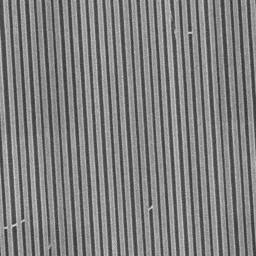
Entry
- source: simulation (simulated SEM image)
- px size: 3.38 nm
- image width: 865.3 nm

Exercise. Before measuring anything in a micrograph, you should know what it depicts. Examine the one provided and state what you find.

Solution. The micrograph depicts parallel lines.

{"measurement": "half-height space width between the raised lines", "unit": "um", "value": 0.0118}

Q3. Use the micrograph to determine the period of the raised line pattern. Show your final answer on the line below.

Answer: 28.7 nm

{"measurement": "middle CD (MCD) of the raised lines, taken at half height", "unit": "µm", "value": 0.0173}